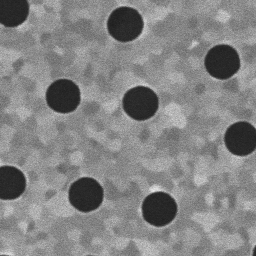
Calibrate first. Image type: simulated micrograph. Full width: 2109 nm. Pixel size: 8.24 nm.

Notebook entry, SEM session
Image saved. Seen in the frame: holes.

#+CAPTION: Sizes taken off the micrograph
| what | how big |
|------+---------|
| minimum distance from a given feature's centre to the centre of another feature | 639 nm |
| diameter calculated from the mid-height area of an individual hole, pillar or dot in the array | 293 nm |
